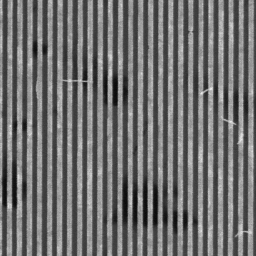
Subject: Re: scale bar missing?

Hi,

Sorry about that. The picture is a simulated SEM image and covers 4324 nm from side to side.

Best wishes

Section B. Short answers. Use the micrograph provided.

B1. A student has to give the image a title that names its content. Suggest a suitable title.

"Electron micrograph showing parallel lines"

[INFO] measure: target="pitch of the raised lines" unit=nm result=170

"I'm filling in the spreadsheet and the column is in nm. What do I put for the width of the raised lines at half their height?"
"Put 73.9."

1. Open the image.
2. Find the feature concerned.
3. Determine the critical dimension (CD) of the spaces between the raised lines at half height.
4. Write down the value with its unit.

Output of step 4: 97.1 nm